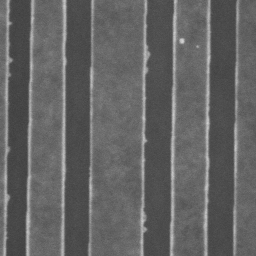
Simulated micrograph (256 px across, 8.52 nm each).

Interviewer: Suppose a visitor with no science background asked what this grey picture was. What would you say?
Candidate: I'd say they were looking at lines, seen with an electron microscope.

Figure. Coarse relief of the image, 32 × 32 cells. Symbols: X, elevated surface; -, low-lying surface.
X---XXXX---XXXXXXX----XXXX----XX
X---XXXX---XXXXXXX----XXXX----XX
X---XXXX---XXXXXXX----XXXX----XX
X---XXXX---XXXXXXX----XXXX----XX
X---XXXX---XXXXXXX----XXXX----XX
X---XXXX---XXXXXXX----XXXX----XX
X---XXXX---XXXXXXX----XXXX----XX
X---XXXX---XXXXXXX----XXXX----XX
X---XXXX---XXXXXXX----XXXX---XXX
X---XXXX---XXXXXXX----XXXX---XXX
X---XXXX---XXXXXXX----XXXX---XXX
X---XXXX---XXXXXXX----XXXX---XXX
X---XXXX---XXXXXXX----XXXX---XXX
X---XXXX---XXXXXXX----XXXX---XXX
X---XXXX---XXXXXXX----XXXX---XXX
X---XXXX---XXXXXXX----XXXX---XXX
X---XXXX---XXXXXXX----XXXX---XXX
X---XXXX---XXXXXXX----XXXX---XXX
X---XXXX---XXXXXXX---XXXXX---XXX
X---XXXX---XXXXXXX---XXXXX---XXX
X---XXXX---XXXXXXX---XXXXX---XXX
X---XXXX---XXXXXXX---XXXXX---XXX
X--XXXXX---XXXXXXX---XXXXX---XXX
X--XXXXX---XXXXXXX---XXXXX---XXX
X--XXXXX---XXXXXXX---XXXXX---XXX
X--XXXXX---XXXXXXX---XXXXX---XXX
X--XXXXX---XXXXXXX---XXXXX---XXX
X--XXXXX---XXXXXXX---XXXXX---XXX
X--XXXXX---XXXXXXX---XXXXX---XXX
X--XXXXX---XXXXXXX---XXXXX---XXX
X--XXXXX---XXXXXXX---XXXXX---XXX
X--XXXXX---XXXXXXX---XXXXX---XXX